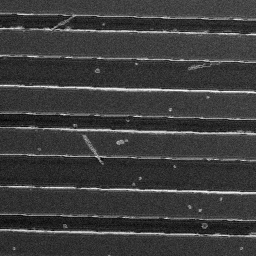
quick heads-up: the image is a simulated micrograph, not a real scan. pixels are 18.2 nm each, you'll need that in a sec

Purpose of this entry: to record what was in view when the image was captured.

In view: lines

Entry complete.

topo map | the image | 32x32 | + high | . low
++++++++++++++++++++++++++++++++
++++++++++++++++++++++++++++++++
................................
................................
++++++++++++++++++++++++++++++++
++++++++++++++++++++++++++++++++
++++++++++++++++++++++++++++++++
.....................+++++++++++
................................
................................
................................
++++++++++++++++++++++++++++++..
++++++++++++++++++++++++++++++++
++++++++++++++++++++++++++++++++
................++++++++++++++++
................................
++++++++++++++++++..............
++++++++++++++++++++++++++++++++
++++++++++++++++++++++++++++++++
............++++++++++++++++++++
................................
................................
................................
++++++++........................
++++++++++++++++++++++++++++++++
++++++++++++++++++++++++++++++++
++++++++++++++++++++++++++++++++
............................++++
................................
++++++++++++++++++++++++++++....
++++++++++++++++++++++++++++++++
++++++++++++++++++++++++++++++++